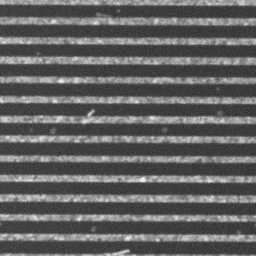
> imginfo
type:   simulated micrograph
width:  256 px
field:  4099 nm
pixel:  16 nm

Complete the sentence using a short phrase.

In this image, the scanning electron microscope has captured parallel lines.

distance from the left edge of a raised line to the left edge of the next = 315 nanometres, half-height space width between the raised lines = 0.222 microns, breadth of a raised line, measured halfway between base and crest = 96 nm